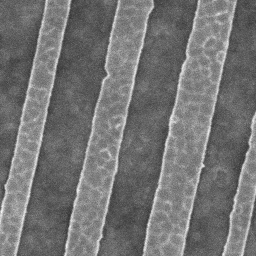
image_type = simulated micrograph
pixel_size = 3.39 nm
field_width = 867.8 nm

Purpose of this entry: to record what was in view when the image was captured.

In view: one or a few lines or trenches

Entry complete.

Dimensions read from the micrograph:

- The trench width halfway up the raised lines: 151 nm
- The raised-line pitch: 260 nanometers